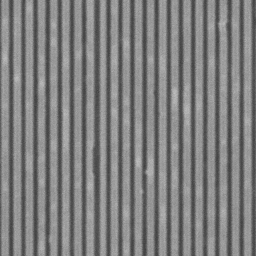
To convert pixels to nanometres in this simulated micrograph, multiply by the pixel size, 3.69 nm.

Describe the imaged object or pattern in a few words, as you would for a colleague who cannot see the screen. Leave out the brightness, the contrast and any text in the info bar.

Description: parallel lines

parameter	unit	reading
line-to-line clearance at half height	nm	22.1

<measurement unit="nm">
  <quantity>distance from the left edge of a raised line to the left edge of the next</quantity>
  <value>44.8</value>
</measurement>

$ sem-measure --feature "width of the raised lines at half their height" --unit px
5.88